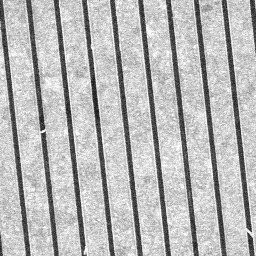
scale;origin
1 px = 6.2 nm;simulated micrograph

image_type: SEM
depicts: parallel lines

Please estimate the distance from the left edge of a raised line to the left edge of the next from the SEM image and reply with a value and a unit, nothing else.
172 nanometers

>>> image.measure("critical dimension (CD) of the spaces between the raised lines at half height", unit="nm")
37.7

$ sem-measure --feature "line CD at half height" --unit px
21.9